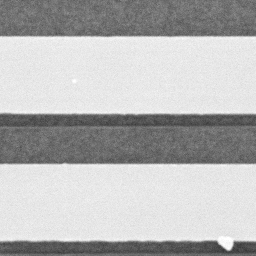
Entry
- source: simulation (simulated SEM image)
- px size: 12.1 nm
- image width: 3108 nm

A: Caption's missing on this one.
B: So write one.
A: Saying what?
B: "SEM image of lines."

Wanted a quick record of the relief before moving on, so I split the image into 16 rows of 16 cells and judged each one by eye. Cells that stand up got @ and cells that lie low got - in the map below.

----------------
----------------
@@@@@@@@@@@@@@@@
@@@@@@@@@@@@@@@@
@@@@@@@@@@@@@@@@
@@@@@@@@@@@@@@@@
@@@@@@@@@@@@@@@@
----------------
----------------
----------------
@@@@@@@@@@@@@@@@
@@@@@@@@@@@@@@@@
@@@@@@@@@@@@@@@@
@@@@@@@@@@@@@@@@
@@@@@@@@@@@@@@@@
----------------